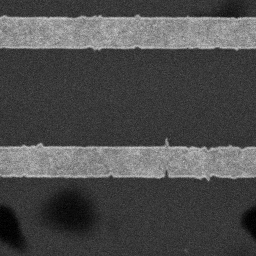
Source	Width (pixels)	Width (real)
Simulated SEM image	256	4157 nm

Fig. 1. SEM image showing one or a few lines or trenches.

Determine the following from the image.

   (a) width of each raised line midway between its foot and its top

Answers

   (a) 469 nm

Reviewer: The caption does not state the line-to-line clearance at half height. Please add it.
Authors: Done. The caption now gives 1620 nm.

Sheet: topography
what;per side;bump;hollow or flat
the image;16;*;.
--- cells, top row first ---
................
****************
****************
................
................
................
................
................
................
****************
****************
................
................
................
................
................